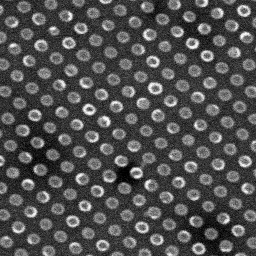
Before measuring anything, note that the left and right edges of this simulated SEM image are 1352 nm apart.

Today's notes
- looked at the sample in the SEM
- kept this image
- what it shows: a regular array of raised bodies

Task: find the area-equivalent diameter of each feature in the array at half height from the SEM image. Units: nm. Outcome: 60.7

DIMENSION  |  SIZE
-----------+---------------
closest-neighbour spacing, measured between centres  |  101 nanometres